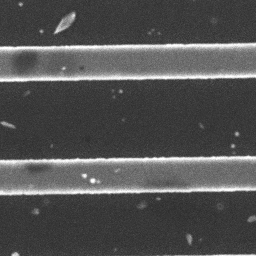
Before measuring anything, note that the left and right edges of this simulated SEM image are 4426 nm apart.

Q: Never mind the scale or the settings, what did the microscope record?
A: lines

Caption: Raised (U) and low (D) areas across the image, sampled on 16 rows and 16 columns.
DDDDDDDDDDDDDDDD
DDDDDDDDDDDDDDDD
DDDDDDDDDDDDDDDD
UUUUUUUUUUUUUUUU
UUUUUUUUUUUUUUUU
DDDDDDDDDDDDDDDD
DDDDDDDDDDDDDDDD
DDDDDDDDDDDDDDDD
DDDDDDDDDDDDDDDD
DDDDDDDDDDDDDDDD
UUUUUUUUUUUUUUUU
UUUUUUUUUUUUUUUU
DDDDDDDDDDDDDDDD
DDDDDDDDDDDDDDDD
DDDDDDDDDDDDDDDD
DDDDDDDDDDDDDDDD